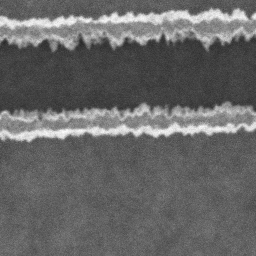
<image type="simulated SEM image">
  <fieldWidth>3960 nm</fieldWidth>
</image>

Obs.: one or a few lines or trenches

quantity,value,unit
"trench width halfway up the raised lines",72.5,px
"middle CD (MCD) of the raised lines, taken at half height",319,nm